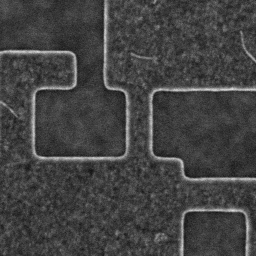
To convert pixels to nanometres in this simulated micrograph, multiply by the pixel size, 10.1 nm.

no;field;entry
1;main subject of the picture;wiring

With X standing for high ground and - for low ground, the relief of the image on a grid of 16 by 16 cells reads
-------XXXXXXXXX
-------XXXXXXXXX
-------XXXXXXXXX
XXXX---XXXXXXXXX
XXXXX--XXXXXXXXX
XXXX---XXXXXXXXX
XX------X-------
XX------X-------
XX------X-------
XX------XX------
XXXXXXXXXXX-----
XXXXXXXXXXXXXXXX
XXXXXXXXXXXXXXXX
XXXXXXXXXXXX---X
XXXXXXXXXXX----X
XXXXXXXXXXX----X